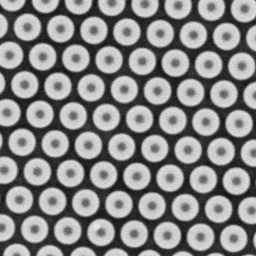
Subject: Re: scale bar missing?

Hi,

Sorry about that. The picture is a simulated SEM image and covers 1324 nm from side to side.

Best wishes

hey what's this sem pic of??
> an array of small figures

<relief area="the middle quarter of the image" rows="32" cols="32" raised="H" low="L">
HHHHHHLLHHHHHHLLLHHHHHHLLHHHHHHL
LHHHHLLLLHHHHLLLLHHHHHLLLHHHHHHL
LLLLLLLLLLLLLLLLLLLHHLLLLLHHHHLL
HLLLLHHHHLLLLLHHHLLLLLLLLLLLLLLL
HHLLHHHHHHLLHHHHHHLLLHHHHHLLLLHH
HHLLHHHHHHLLHHHHHHLLHHHHHHLLLHHH
HHLLHHHHHHLLHHHHHHLLHHHHHHHLHHHH
HLLLHHHHHHLLHHHHHHLLHHHHHHHLHHHH
LLLLLHHHHLLLLHHHHHLLLHHHHHLLLHHH
LLLLLLLLLLLLLLHHLLLLLHHHHLLLLHHH
HHHHHLLLLHHHLLLLLLLLLLLLLLLLLLLL
HHHHHLLLHHHHHLLLHHHHHLLLLHHHHLLL
HHHHHHLHHHHHHHLLHHHHHHLLHHHHHHLL
HHHHHLLHHHHHHHLLHHHHHHLLHHHHHHLL
HHHHHLLLHHHHHHLLHHHHHHLLHHHHHHLL
HHHHLLLLHHHHHLLLHHHHHHLLHHHHHHLL
LLLLLLLLLLHHLLLLLHHHHLLLLHHHHHLL
LLLLHHHHLLLLLLLLLLLLLLLLLLLLLLLL
HLLHHHHHHLLLHHHHHLLLLHHHHLLLLLHH
HLLHHHHHHLLHHHHHHLLLHHHHHHLLHHHH
HLLHHHHHHLLHHHHHHHLLHHHHHHLLHHHH
HLLHHHHHHLLHHHHHHHLHHHHHHHLLHHHH
LLLLHHHHHLLLHHHHHLLLHHHHHHLLHHHH
LLLLLHHLLLLLLHHHLLLLHHHHHLLLHHHH
HHHLLLLLLLLLLLLLLLLLLLLLLLLLLLHH
HHHHLLLHHHHHLLLLHHHHLLLLLHHHLLLL
HHHHHLLHHHHHHLLHHHHHHLLLHHHHHLLL
HHHHHLLHHHHHHLLHHHHHHLLHHHHHHHLL
HHHHHLLHHHHHHLLHHHHHHLLHHHHHHHLL
HHHHLLLHHHHHHLLHHHHHHLLHHHHHHHLL
LHHLLLLLHHHHLLLLHHHHLLLLHHHHHLLL
LLLLLLLLLLLLLLLLLLLLLLLLLHHHLLLL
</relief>